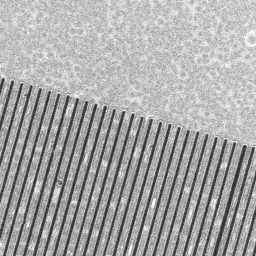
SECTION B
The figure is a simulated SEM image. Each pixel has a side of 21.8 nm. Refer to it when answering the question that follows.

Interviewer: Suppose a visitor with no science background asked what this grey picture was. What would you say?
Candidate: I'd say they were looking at parallel lines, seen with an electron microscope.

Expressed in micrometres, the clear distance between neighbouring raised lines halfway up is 0.113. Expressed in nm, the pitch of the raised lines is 209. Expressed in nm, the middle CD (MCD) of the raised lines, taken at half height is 100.